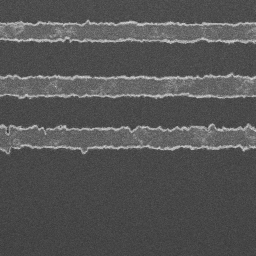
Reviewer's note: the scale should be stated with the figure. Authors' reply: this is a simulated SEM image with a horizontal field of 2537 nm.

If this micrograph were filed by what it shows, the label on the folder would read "parallel lines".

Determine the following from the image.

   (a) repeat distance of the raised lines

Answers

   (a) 524 nm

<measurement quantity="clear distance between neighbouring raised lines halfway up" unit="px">34.4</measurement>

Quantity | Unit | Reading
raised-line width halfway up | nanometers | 180